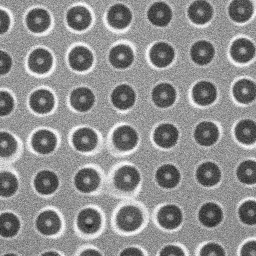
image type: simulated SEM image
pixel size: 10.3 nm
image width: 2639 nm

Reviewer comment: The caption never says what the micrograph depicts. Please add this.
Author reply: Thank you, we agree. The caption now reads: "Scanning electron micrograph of an array of small figures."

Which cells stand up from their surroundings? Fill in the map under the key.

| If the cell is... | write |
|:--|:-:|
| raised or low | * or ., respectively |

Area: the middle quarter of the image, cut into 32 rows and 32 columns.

*......*****.....*****....******
**....********.*****************
********************************
********************************
********************************
****.********....******....*****
**.....*****......****......****
*.......****......****.......**.
*...*...***...**..****......****
*...*...****......****......****
**.....*****.....******....*****
**....*******...****************
********************************
********************************
********************************
*************....******.....****
***.....****......****.......***
**......****......****...*...***
**.......**....*...***...*...***
**.......**........***......****
**.......***......*****....*****
***.....****.....***************
**************.*****************
********************************
********************************
******.*******...*******....****
****....*****.....*****......***
***......***.......****......***
**........**...*...****..*...***
**...*....**.......****......***
***.......**.......*****....****
***......***......**************